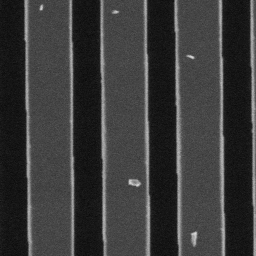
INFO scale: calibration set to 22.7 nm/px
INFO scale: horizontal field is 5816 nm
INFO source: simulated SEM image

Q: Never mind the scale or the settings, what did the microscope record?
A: lines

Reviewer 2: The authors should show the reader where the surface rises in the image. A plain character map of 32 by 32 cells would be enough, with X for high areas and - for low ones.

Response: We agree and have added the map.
---XXXXXX----XXXXX----XXXXXX---X
---XXXXXX----XXXXX----XXXXXX---X
---XXXXXX----XXXXX----XXXXXX---X
---XXXXXX----XXXXX----XXXXXX---X
---XXXXXX----XXXXX----XXXXXX----
---XXXXXX----XXXXX----XXXXXX----
---XXXXXX----XXXXX----XXXXXX----
---XXXXXX----XXXXX----XXXXXX----
---XXXXXX----XXXXX----XXXXXX----
---XXXXXX----XXXXX----XXXXXX----
---XXXXXX----XXXXX----XXXXXX----
---XXXXXX----XXXXX----XXXXXX----
---XXXXXX----XXXXX----XXXXXX----
---XXXXXX----XXXXX----XXXXXX----
---XXXXXX----XXXXX----XXXXXX----
---XXXXXX----XXXXX----XXXXXX----
---XXXXXX----XXXXX----XXXXXX----
---XXXXXX----XXXXX----XXXXXX----
----XXXXX----XXXXX----XXXXXX----
----XXXXX----XXXXX----XXXXXX----
----XXXXX----XXXXXX---XXXXXX----
----XXXXX----XXXXXX---XXXXXX----
----XXXXX----XXXXXX---XXXXXX----
----XXXXX----XXXXXX---XXXXXX----
----XXXXX----XXXXXX---XXXXXX----
----XXXXX----XXXXXX---XXXXXX----
----XXXXX----XXXXXX---XXXXXX----
----XXXXX----XXXXXX---XXXXXX----
----XXXXX----XXXXXX---XXXXXX----
----XXXXX----XXXXXX---XXXXXX----
----XXXXX----XXXXXX---XXXXXX----
----XXXXX----XXXXXX---XXXXXX----